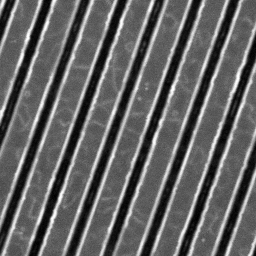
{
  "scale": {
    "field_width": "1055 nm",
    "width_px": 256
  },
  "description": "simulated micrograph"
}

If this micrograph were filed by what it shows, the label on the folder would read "parallel lines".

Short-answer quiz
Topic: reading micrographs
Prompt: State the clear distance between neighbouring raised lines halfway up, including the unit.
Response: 39.4 nm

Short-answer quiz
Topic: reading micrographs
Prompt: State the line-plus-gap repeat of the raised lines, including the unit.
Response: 145 nanometres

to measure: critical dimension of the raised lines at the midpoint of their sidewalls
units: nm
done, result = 106